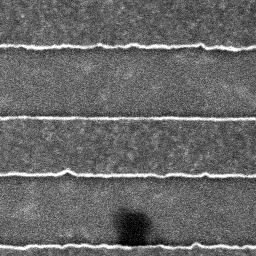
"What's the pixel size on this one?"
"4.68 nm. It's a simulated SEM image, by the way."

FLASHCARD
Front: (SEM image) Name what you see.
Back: one or a few lines or trenches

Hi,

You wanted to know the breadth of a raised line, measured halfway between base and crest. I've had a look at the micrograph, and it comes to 273 nm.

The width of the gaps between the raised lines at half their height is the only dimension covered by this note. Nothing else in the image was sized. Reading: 329 nanometers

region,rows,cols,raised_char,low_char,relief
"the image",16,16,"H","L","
HHHHHHHHHHHHHHHH
HHHHHHHHHHHHHHHH
HHHHHHHHHHHHHHHH
LLLLLLLLLLLLLLLL
LLLLLLLLLLLLLLLL
LLLLLLLLLLLLLLLL
LLLLLLLLLLLLLLLL
HHHHHHHHHHHHHHHH
HHHHHHHHHHHHHHHH
HHHHHHHHHHHHHHHH
HHHHHHHHHHHHHHHH
LLLLLLLLLLLLLLLL
LLLLLLLLLLLLLLLL
LLLLLLLLLLLLLLLL
LLLLLLLLLLLLLLLL
HHHHHHHHHHHHHHHH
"